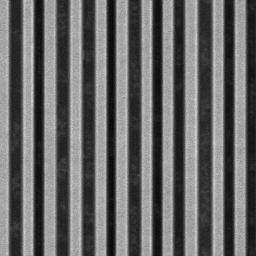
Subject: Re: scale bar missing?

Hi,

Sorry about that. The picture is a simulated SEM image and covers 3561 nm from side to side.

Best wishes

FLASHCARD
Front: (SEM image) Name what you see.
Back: parallel lines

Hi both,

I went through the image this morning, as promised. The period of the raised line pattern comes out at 327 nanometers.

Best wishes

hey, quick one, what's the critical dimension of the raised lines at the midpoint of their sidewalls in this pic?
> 0.164 µm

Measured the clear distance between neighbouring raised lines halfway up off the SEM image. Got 0.164 µm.